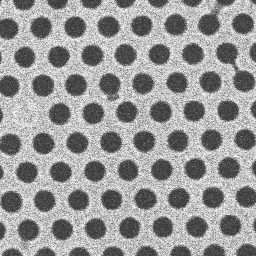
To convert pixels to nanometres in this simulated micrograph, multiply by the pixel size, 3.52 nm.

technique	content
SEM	a regular array of holes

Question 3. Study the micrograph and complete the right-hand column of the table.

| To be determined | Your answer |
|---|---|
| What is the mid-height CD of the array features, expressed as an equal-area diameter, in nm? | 74.7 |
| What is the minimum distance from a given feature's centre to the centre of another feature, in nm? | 116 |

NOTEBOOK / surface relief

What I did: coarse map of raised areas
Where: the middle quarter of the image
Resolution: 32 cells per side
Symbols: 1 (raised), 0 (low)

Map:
11111110111111111111111111111111
11111111111111111111111111111111
11111111111011111110011111100011
10000111100000111000001111000001
00000011100000111000001111000001
00000011100000111000001111000001
10000111100000111100001111100011
10001111110000111110111111111111
11111111111000111111111111111111
11111111111111001111111001111110
01111000011110000011110000111100
01111000001110000011100000011100
00111000001110000011100000011100
01111000001110000011110000111110
01111100011111100111111001111111
11111111111111111111111111111111
11111111111111111111111111111111
11001111110001111100001111000011
10000011100000111000000111000001
10000011100000111000000111000001
10000011100000111100000111000001
10000111110000111100001111100011
11101111111111111111111111111111
11111111111111111111111111111111
11111110011111000111111000111110
01111000001111000011110000011100
00111000001110000001110000011100
00111000001111000001110000011100
00111100001111000011111000111111
11111111111111111111111111111111
11111111111111111111111111111111
11101111111011111110001111100011